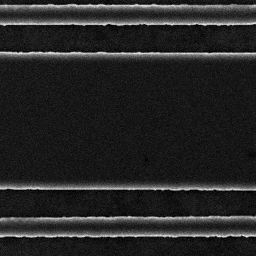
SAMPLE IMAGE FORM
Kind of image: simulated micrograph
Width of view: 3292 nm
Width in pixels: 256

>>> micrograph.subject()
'lines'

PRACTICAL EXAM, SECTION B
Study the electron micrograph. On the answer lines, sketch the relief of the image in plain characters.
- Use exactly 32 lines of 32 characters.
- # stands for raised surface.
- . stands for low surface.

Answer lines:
................................
################################
################################
................................
................................
................................
................................
################################
################################
################################
################################
################################
################################
################################
################################
################################
################################
################################
################################
################################
################################
################################
################################
################################
................................
................................
................................
################################
################################
#.################..###.##.##.#.
................................
................................